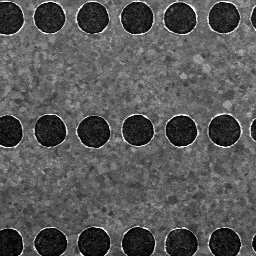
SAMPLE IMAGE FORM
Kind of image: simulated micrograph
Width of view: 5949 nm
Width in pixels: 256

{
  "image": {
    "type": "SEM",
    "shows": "a regular array of holes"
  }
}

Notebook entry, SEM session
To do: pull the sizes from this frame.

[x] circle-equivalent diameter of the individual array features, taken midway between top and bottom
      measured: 751 nm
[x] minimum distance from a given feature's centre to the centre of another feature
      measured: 1010 nanometres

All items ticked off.